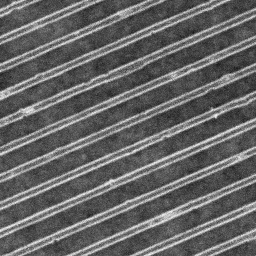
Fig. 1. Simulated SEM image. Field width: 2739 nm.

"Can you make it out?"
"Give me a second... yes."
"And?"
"parallel lines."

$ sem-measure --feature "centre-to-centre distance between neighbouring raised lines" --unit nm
271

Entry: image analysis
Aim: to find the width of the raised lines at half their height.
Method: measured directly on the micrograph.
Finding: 63.8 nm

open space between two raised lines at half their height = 200 nanometers